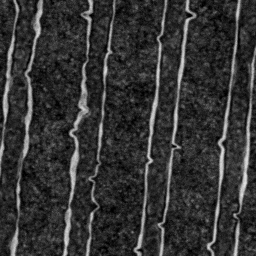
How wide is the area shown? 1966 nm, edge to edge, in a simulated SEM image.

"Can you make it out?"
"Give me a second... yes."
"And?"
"one or a few lines or trenches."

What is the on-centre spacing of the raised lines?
565 nm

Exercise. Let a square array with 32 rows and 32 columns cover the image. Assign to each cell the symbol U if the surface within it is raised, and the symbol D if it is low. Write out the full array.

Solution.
UUDDDUUUUUUDDDUUUUUUUDDUUUUUUUDD
UUDDDUUUUUUDDDUUUUUUUDDDUUUUUUDD
UUDDDUUUUUUDDDUUUUUUDDDDUUUUUUDD
UUDDDUUUUUUDDDUUUUUUDDDUUUUUUUDD
UUDDDUUUUUUDDDUUUUUUDDDUUUUUUUDD
UUDDUUUUUUUDDDUUUUUUDDDUUUUUUUDD
UDDDUUUUUUUDDUUUUUUUDDDUUUUUUDDD
UDDDUUUUUUUDDUUUUUUUDDDUUUUUUDDD
UDDDUUUUUUUDDUUUUUUUDDDUUUUUUDDU
UDDUUUUUUUUDDUUUUUUUDDDUUUUUUDDU
UDDDUUUUUUDDDUUUUUUUDDUUUUUUUDDU
UDDDUUUUUUUDDUUUUUUUDDUUUUUUUDDU
UDDDUUUUUUUDDUUUUUUUDDUUUUUUUDDU
UDDDUUUUUUUDDUUUUUUDDDUUUUUUUDDU
UDDUUUUUUUDDDUUUUUUDDDUUUUUUDDDU
UDDUUUUUUDDDDUUUUUUDDDUUUUUUDDDU
UDDUUUUUUDDDDUUUUUUDDDUUUUUUDDDU
DDDUUUUUUDDDDUUUUUUDDDUUUUUUDDDU
DDDUUUUUUUDDUUUUUUUDDDUUUUUUDDDU
DDDUUUUUUUDDUUUUUUUDDUUUUUUUDDDU
DDDUUUUUUDDDUUUUUUUDDUUUUUUUDDDU
DDDUUUUUUDDDUUUUUUDDDUUUUUUUDDDU
DDUUUUUUUDDUUUUUUUDDDUUUUUUUDDDU
DDUUUUUUUDDDUUUUUUDDDUUUUUUUDDUU
DDUUUUUUUDDDUUUUUUDDDUUUUUUDDDUU
DDUUUUUUUDDDUUUUUUDDDUUUUUUDDDUU
DDUUUUUUUDDDUUUUUUDDDUUUUUUDDDUU
DDUUUUUUUDDUUUUUUUDDUUUUUUUDDDUU
DDUUUUUUUDDUUUUUUUDDUUUUUUUDDDUU
DDUUUUUUUDDUUUUUUUDDUUUUUUUDDDUU
DDUUUUUUDDDUUUUUUUDDUUUUUUDDDDUU
DDUUUUUUDDDUUUUUUDDDUUUUUUDDDUUU